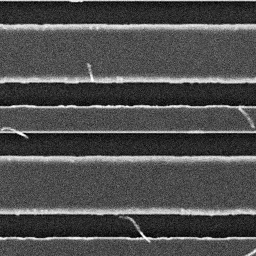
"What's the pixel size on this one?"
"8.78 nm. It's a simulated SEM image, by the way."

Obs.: lines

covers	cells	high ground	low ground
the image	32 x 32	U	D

DDDDDDDDDDDDDDDDDDDDDDDDDDDDDDDD
DDDDDDDDDDDDDDDDDDDDDDDDDDDDDDDD
DDDDDDDDDDDDDDDDDDDDDDDDDDDDDDDD
UUUUUUUUUUUUUUUUUUUUUUUUUUUUUUUU
UUUUUUUUUUUUUUUUUUUUUUUUUUUUUUUU
UUUUUUUUUUUUUUUUUUUUUUUUUUUUUUUU
UUUUUUUUUUUUUUUUUUUUUUUUUUUUUUUU
UUUUUUUUUUUUUUUUUUUUUUUUUUUUUUUU
UUUUUUUUUUUUUUUUUUUUUUUUUUUUUUUU
UUUUUUUUUUUUUUUUUUUUUUUUUUUUUUUU
DDDDDDDDDDDDDDDDDDDDDDDDDDDDDDDD
DDDDDDDDDDDDDDDDDDDDDDDDDDDDDDDD
DDDDDDDDDDDDDDDDDDDDDDDDDDDDDDDD
UUUUUUUUUUUUUUUUUUUUUUUUUUUUUUUU
UUUUUUUUUUUUUUUUUUUUUUUUUUUUUUUU
UUUUUUUUUUUUUUUUUUUUUUUUUUUUUUUU
UUUUUUUUUUUUUUUUUUUUUUUUUUUUUUUU
DDDDDDDDDDDDDDDDDDDDDDDDDDDDDDDD
DDDDDDDDDDDDDDDDDDDDDDDDDDDDDDDD
DDDDDDDDDDDDDDDDDDDDDDDDDDDDDDDD
UUUUUUUUUUUUUUUUUUUUUUUUUUUUUUUU
UUUUUUUUUUUUUUUUUUUUUUUUUUUUUUUU
UUUUUUUUUUUUUUUUUUUUUUUUUUUUUUUU
UUUUUUUUUUUUUUUUUUUUUUUUUUUUUUUU
UUUUUUUUUUUUUUUUUUUUUUUUUUUUUUUU
UUUUUUUUUUUUUUUUUUUUUUUUUUUUUUUU
UUUUUUUDUUUUUUUUDUUDUDUUUUUUUUUU
DDDDDDDDDDDDDDDDDDDDDDDDDDDDDDDD
DDDDDDDDDDDDDDDDDDDDDDDDDDDDDDDD
DDDDDDDDDDDDDDDDDDDDDDDDDDDDDDDD
UUUUUUUUUUUUUUUUUUUUUUUUUUUUUUUU
UUUUUUUUUUUUUUUUUUUUUUUUUUUUUUUU